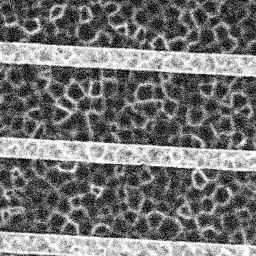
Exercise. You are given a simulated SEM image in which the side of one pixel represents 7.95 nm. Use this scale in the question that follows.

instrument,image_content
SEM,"one or a few lines or trenches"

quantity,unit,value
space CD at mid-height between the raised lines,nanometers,604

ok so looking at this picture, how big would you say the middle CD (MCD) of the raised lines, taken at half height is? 148 nm